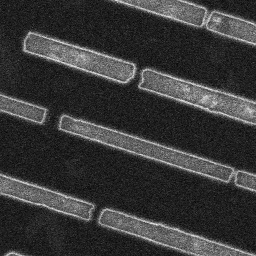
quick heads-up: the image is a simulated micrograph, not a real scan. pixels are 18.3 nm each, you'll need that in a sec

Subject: one or a few lines or trenches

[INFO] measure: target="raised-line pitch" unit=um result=1.29